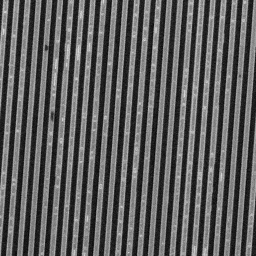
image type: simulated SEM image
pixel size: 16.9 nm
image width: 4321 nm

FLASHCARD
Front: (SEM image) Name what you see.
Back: parallel lines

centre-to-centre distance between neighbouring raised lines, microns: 0.183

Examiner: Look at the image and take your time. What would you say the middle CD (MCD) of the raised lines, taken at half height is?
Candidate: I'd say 4.86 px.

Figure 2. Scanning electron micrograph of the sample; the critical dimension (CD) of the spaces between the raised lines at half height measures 98.9 nanometres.